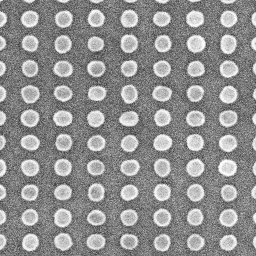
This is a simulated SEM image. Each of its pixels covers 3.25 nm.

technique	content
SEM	a regular array of raised bodies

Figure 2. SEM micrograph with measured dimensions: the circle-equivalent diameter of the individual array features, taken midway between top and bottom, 0.0499 um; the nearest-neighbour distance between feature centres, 0.08 um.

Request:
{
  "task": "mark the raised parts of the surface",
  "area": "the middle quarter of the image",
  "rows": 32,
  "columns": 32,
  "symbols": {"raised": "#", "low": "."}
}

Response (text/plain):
##....####.....###.....###.....#
##....####....####.....###.....#
#......##......##......###.....#
................................
................................
................#...............
#......###.....###.....####....#
##....####.....###....#####....#
#......###.....###.....###.....#
................................
................................
................................
#.....###......###.....###.....#
##....####....####.....###.....#
##....####....####.....###.....#
................................
................................
................................
#......##......###.....###.....#
##....####....####.....####....#
##....####....####.....####....#
#......##......##...............
................................
................................
#......##......###.....###......
##....####....#####....###.....#
##....####....####.....###.....#
#......##......###.....###.....#
................................
................................
.......##...............##......
#......###.....###.....###.....#